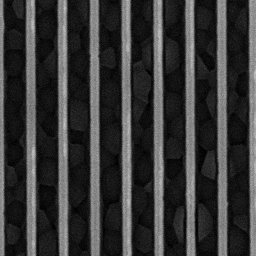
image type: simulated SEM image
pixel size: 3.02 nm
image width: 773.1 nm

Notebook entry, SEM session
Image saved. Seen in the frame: parallel lines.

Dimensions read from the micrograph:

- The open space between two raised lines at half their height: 23.3 pixels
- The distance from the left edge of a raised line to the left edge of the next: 96.3 nm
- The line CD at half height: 25.3 nm